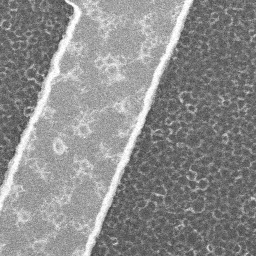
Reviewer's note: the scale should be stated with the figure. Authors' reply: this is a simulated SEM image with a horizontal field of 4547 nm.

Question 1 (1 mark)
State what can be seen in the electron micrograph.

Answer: one or a few lines or trenches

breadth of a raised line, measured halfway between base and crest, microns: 1.74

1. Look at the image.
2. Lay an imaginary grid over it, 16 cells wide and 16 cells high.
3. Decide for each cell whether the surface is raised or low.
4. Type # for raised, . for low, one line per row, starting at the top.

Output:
.....#######....
.....######.....
....#######.....
....######......
...#######......
...#######......
...######.......
..#######.......
..######........
.#######........
.#######........
.######.........
#######.........
######..........
######..........
######..........